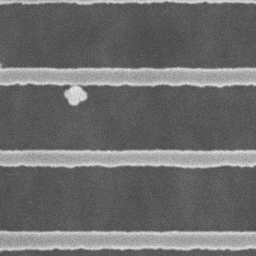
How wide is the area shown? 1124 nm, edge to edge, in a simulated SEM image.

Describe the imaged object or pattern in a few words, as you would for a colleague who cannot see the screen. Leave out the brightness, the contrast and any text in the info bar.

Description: lines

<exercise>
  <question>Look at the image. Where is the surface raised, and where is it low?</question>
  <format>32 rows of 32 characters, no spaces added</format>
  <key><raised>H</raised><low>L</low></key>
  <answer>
LLLLLLLLLLLLLLLLLLLLLLLLLLLLLLLL
LLLLLLLLLLLLLLLLLLLLLLLLLLLLLLLL
LLLLLLLLLLLLLLLLLLLLLLLLLLLLLLLL
LLLLLLLLLLLLLLLLLLLLLLLLLLLLLLLL
LLLLLLLLLLLLLLLLLLLLLLLLLLLLLLLL
LLLLLLLLLLLLLLLLLLLLLLLLLLLLLLLL
LLLLLLLLLLLLLLLLLLLLLLLLLLLLLLLL
LLLLLLLLLLLLLLLLLLLLLLLLLLLLLLLL
LLLLLLLLLLLLLLLLLLLLLLHLLLLLLLLL
HHHHHHHHHHHHHHHHHHHHHHHHHHHHHHHH
HHHLHHHHHHHHHHHHHHHHHHHHHHHHHHHH
LLLLLLLLHHHLLLLLLLLLLLLLLLLLLLLL
LLLLLLLLLHLLLLLLLLLLLLLLLLLLLLLL
LLLLLLLLLLLLLLLLLLLLLLLLLLLLLLLL
LLLLLLLLLLLLLLLLLLLLLLLLLLLLLLLL
LLLLLLLLLLLLLLLLLLLLLLLLLLLLLLLL
LLLLLLLLLLLLLLLLLLLLLLLLLLLLLLLL
LLLLLLLLLLLLLLLLLLLLLLLLLLLLLLLL
LLLLLLLLLLLLLLLLLLLLLLLLLLLLLLLL
HHHHHHHHHHHHHHHHHHHHHHHHHHHHHHHH
HHHHHHHHHHHHHHHHHHHHHHHHHHHHHHHH
LLLLLLLLLLLLLLLLLLLLLLLLLLLLLLLL
LLLLLLLLLLLLLLLLLLLLLLLLLLLLLLLL
LLLLLLLLLLLLLLLLLLLLLLLLLLLLLLLL
LLLLLLLLLLLLLLLLLLLLLLLLLLLLLLLL
LLLLLLLLLLLLLLLLLLLLLLLLLLLLLLLL
LLLLLLLLLLLLLLLLLLLLLLLLLLLLLLLL
LLLLLLLLLLLLLLLLLLLLLLLLLLLLLLLL
LLLLLLLLLLLLLLLLLLLLLLLLLLLLLLLL
HHHHHHHHHHHHHHHHHHHHHHHHHHHHHHHH
HHHHHHHHHHHHHHHHHHHHHHHHHHHHHHHH
LLLLLLLLLLLLLLLLLLLLLLLLLLLLLLLL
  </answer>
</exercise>